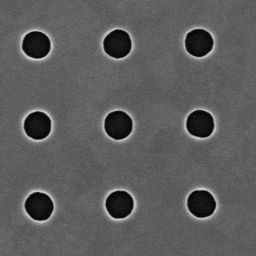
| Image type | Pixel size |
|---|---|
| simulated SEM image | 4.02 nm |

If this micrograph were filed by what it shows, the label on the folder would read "a regular array of holes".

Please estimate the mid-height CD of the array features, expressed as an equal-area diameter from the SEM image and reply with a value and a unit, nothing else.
0.117 microns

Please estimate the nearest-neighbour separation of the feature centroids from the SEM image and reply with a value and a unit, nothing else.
323 nm